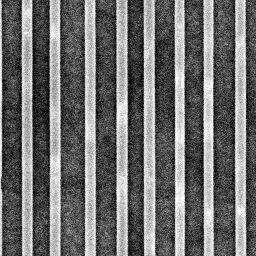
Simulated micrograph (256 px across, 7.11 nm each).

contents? parallel lines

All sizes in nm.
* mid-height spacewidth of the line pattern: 145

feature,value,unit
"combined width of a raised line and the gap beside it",0.217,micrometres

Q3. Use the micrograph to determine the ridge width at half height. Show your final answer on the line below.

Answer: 72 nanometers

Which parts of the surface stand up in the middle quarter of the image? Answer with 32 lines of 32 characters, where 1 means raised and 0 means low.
00000111000001110000111000001100
00000111000001110000111000001100
00000111000001110000111000001100
00000111000001110000111000001100
00000111000001110000111000001100
00000111000001110000111000001100
00000111000001110000111000001100
00000111000001110000111000001100
00000111000001110000111000001100
00000111000001110000111000001100
00000111000001110000111000001100
00000111000001110000111000001100
00000111000001110000111000001100
00000111000001110000111000001100
00000111000001110000111000001100
00000111000001110000111000001100
00000111000001110000111000001100
00000111000001110000111000001100
00000111000001110000111000001100
00000111000001110000111000001100
00000111000001110000111000001100
00000111000001110000111000001100
00000111000001110000111000001100
00000111000001110000111000001100
00000111000001110000111000001100
00000111000001110000111000001100
00000111000001110000111000001100
00000111000001110000111000001100
00000111000001110000111000001100
00000111000001110000111000001100
00000111000001110000111000001100
00000111000001110000111000001100